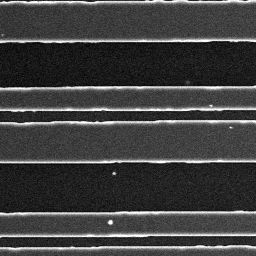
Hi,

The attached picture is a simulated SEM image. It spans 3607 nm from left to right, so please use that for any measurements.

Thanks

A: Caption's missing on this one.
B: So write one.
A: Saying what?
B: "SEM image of lines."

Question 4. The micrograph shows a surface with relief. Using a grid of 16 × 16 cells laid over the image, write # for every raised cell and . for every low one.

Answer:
################
################
################
................
................
.###############
################
################
################
################
................
................
................
################
################
################